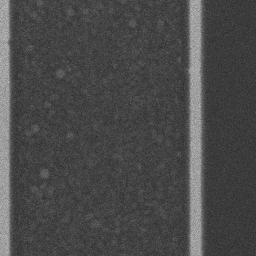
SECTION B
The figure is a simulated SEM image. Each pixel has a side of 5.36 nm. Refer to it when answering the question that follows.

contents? one or a few lines or trenches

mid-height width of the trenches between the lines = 1020 nm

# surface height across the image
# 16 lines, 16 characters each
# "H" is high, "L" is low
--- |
LLLLLLLLLLLLHHHH
LLLLLLLLLLLLHHHH
LLLLLLLLLLLLHHHH
LLLLLLLLLLLLHHHH
LLLLLLLLLLLLHHHH
LLLLLLLLLLLLHHHH
LLLLLLLLLLLLHHHH
LLLLLLLLLLLLHHHH
LLLLLLLLLLLLHHHH
LLLLLLLLLLLLHHHH
LLLLLLLLLLLLHHHH
LLLLLLLLLLLLHHHH
LLLLLLLLLLLLHHHH
LLLLLLLLLLLLHHHH
LLLLLLLLLLLLHHHH
LLLLLLLLLLLLHHHH